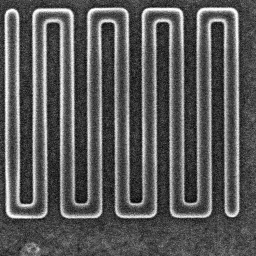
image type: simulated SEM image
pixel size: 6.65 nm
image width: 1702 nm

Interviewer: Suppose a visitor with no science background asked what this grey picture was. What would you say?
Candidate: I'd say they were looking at groups of lines, slits or small figures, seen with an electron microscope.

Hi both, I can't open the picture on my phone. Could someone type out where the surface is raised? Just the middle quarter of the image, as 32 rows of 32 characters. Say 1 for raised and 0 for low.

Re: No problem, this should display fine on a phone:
11000011100001110000111000011100
11000011100001110000111000011100
11000011100001110000111000011100
11000011100001110000111000011100
11000011100001110000111000011100
11000011100001110000111000011100
11000011100001110000111000011100
11000011100001110000111000011100
11000011100001110000111000011100
11000011100001110000111000011100
11000011100001110000111000011100
11000011100001110000111000011100
11000011100001110000111000011100
11000011100001110000111000011100
11000011100001110000111000011100
11000011100001110000111000011100
11000011100001110000111000011100
11000011100001110000111000011100
11000011100001110000111000011100
11000011100001110000111000011100
11000011100001110000111000011100
11000011100001110000111000011100
11000011100001110000111000011100
11000011100001110000111000011100
11000011100001110000111000011100
11000011100001110000111000011100
11000011100001110000111000011100
11000011100001110000111000011100
11000011100001110000111000011100
11000011100001110000111000011100
11000011100001110000111000011100
11000011100001110000111000011100